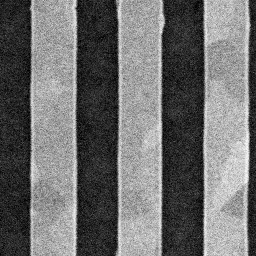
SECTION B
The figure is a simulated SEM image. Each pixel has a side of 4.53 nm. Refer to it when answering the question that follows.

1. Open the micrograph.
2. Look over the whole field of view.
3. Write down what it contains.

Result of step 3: one or a few lines or trenches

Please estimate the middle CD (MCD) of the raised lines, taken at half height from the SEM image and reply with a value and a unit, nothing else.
42.4 px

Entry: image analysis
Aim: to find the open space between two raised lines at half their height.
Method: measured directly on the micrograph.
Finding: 200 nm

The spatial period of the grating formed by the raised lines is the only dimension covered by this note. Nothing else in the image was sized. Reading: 391 nm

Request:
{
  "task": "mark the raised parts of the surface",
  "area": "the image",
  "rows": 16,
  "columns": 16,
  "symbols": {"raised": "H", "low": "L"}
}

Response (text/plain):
LLHHHLLHHHLLLHHL
LLHHHLLHHHLLLHHH
LLHHHLLHHHLLLHHL
LLHHHLLLHHLLLHHL
LLHHHLLLHHLLLHHL
LLHHHLLLHHLLLHHL
LLHHHLLHHHLLLHHL
LLHHHLLHHHLLLHHL
LLHHHLLHHHLLLHHL
LLHHHLLHHHLLLHHL
LLHHHLLHHHLLLHHL
LLHHHLLHHHLLLHHL
LLHHHLLHHHLLLHHL
LLHHHLLHHHLLLHHL
LLHHHLLHHHLLLHHL
LLHHHLLHHHLLLHHL